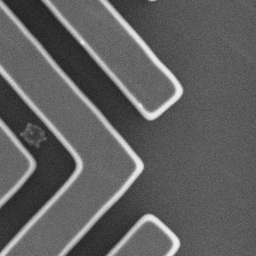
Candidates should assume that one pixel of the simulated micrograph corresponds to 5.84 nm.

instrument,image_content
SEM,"groups of lines, slits or small figures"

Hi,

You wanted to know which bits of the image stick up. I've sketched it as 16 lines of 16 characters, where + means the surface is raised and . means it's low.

...++++.........
+...++++........
++...++++.......
+++...++++......
++++...++++.....
.++++...+++.....
..++++..+++.....
...++++.........
+...+++.........
++..++++........
++...++++.......
+...++++........
...++++.........
..++++..........
.++++...+++.....
++++...++++.....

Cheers